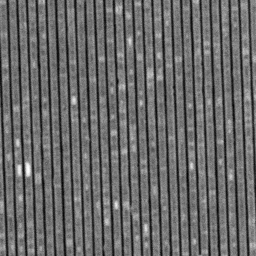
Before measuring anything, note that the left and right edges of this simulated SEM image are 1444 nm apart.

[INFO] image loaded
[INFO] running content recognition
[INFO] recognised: parallel lines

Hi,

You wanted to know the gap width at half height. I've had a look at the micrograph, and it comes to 10.6 nm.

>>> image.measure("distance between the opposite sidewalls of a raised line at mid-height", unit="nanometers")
41.5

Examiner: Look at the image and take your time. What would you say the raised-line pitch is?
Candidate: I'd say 0.0544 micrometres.